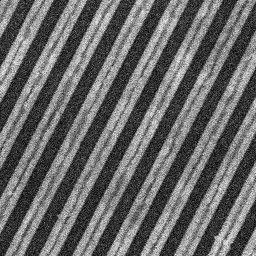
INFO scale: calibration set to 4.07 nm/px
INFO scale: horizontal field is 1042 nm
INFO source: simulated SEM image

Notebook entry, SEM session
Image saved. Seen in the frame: parallel lines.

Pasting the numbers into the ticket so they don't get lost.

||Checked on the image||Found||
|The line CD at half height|49.3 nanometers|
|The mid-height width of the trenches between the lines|74.1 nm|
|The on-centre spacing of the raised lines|122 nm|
